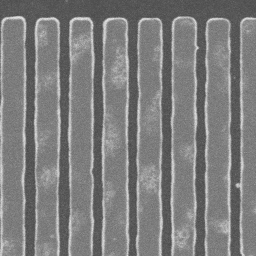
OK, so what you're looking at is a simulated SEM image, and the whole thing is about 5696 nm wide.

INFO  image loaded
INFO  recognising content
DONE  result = parallel lines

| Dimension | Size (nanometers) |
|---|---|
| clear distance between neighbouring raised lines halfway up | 248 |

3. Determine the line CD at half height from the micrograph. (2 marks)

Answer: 517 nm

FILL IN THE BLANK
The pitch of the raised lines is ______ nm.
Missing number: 761